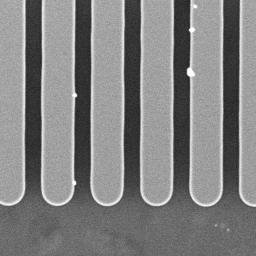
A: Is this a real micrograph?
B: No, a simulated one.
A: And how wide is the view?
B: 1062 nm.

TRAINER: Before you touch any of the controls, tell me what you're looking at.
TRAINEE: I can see groups of lines, slits or small figures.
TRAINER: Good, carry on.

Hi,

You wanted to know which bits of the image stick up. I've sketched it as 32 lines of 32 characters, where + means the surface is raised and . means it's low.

+++..++++..++++...++++..++++..++
+++..++++..++++...++++..++++..++
+++..++++..++++...++++..++++..++
+++..++++..++++...++++..++++..++
+++..++++..++++...++++..++++..++
+++..++++..++++...++++..++++..++
+++..++++..++++...++++..++++..++
+++..++++..++++...++++..++++..++
+++..++++..++++...++++..++++..++
+++..++++..++++...++++..++++..++
+++..++++..++++...++++..++++..++
+++..++++..++++...++++..++++..++
+++..++++..++++...++++..++++..++
+++..++++..++++...++++..++++..++
+++..++++..++++...++++..++++..++
+++..++++..++++...++++..++++..++
+++..++++..++++...++++..++++..++
+++..++++..++++...++++..++++..++
+++..++++..++++...++++..++++..++
+++..++++..++++...++++..++++..++
+++..++++..++++...++++..++++..++
+++..++++..++++...++++..++++..++
+++..++++..++++...++++..++++..++
+++..++++..++++...++++..++++..++
+++..++++...+++...+++...++++..++
++....++.....+.....+.....++....+
................................
................................
................................
................................
................................
................................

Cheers